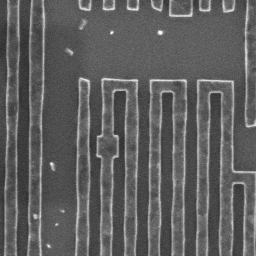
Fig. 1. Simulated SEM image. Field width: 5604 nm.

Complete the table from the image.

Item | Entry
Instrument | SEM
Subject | wiring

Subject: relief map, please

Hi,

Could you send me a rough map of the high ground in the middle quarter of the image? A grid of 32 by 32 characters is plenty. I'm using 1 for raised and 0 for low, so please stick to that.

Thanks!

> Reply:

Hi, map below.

00000000000000000000000000000000
00000000000000000000000000000000
00000000000000000000000000000000
00000000000000000000000000000000
00001100001111111100001111111110
00001100001111111100001111111110
00001100001111111100001111111110
00001100001100001100001100011110
00001100001100001100001100011110
00001100001100001100001100011110
00001100001100001100001100011110
00001100001100011100011100011110
00001100001100011110011100011110
00001100001100011110011100011110
00001100001100011110011100011100
00001100001100011110011100011100
00001100001100011110011100011100
00001100011100011110011100011100
00011100111110011100001100011100
00011100111110011100001100011100
00011100111110011100011100011100
00011100111110011100011100011100
00011100111110011100011100011100
00011100011100011100011100011100
00011100011100011100011100011100
00011100011100011100011100011100
00011100011100011100011100011100
00011100011100011100011100011100
00011100011100011100011100011100
00011100011100011100011100011100
00011100011100011100011100011100
00011100011100011100011100011100